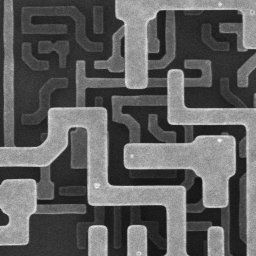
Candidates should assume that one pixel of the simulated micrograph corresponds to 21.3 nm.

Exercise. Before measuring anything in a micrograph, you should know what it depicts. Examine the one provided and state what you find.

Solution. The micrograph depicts wiring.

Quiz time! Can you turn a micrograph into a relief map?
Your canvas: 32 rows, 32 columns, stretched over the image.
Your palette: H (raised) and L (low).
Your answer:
LLLLLLLLLLLLLLLHHHHHHHHHHHHHHHHH
LLLLLLLLLLLLLLLHHHHHLLLLLLLLLLHH
LLLLLLLLLLLLLLLHHHHLLLLLLLLLLLHH
LLLLLLLLLLLLLLLLHHLLLLLLLLLLLLHH
LLLLLLLLLLLLLLLLHHLLLLLLLLLLLLHH
LLLLLLLLLLLLLLLLHHLLLLLLLLLLLLHH
LLLLLLLLLLLLLLLLHHLLLLLLLLLLLLLL
LLLLLLLLLLLLLLLLHHLLLLLLLLLLLLLL
LLLLLLLLLLLLLLLLHHLLLLLLLLLLLLLL
LLLLLLLLLLLLLLLLHHLLLHHLLLLLLLLL
LLLLLLLLLLLLLLLLHHLLLHHLLLLLLLLL
LLLLLLLLLLLLLLLLLLLLLHHLLLLLLLLL
LLLLLLLLLLLLLLLLLLLLLHHLLLLLLLLL
LLLLLLLLLLHHHLLLLLLLLHHHLLLLLLLL
LLLLLLHHHHHHHLLLLLLLLHHHHHHHHHHH
LLLLLLHHHHHHHLLLLLLLLHHHHHHHHHHH
LLLLLLHHHLLHHLLLLLLLLLLLLLLLLLLH
LLLLLLHHLLLHHLLLLLLLLLLLHHHHHLLH
HHHHHHHHLLLHHLLLHHHHHHHHHHHHHLLH
HHHHHHHLLLLHHLLLHHHHHHHHHHHHHLLH
HHHHHHLLLLLHHLLLHHHHHHHHHHHHHLLH
LLLLLLLLLLLHHLLLLLLLLLLLHHHHHLLH
LHHHLLLLLLLHHHLLLLLLLLLLLHHHHLLH
HHHHLLLLLLLHHHHHHHHHHHHLLHHHLLLH
HHHHLLLLLLLHHHHHHHHHHHHLLHHHLLLH
HHHHLLLLLLLHHHHHHHHHHHHLLHHHLLLH
HHHHLLLLLLLLLLLLLLLLLHHLLLLLLLLH
LHHHLLLLLLLLLLLLLLLLLHHLLLLLLLLH
HHHHLLLLLLLHHLLLHHLLLHHLLLHHLLLH
HHHHLLLLLLLHHLLLHHLLLHHLLLHHLLLH
HHHLLLLLLLLHHLLLHHLLLHHLLLHHLLLH
LLLLLLLLLLLHHLLLHHLLLHHLLLHHLLLH